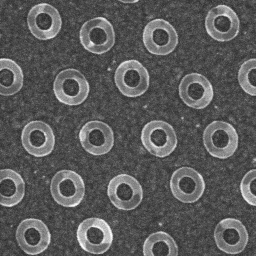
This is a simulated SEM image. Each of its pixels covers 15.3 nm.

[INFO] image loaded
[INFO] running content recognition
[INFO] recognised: a regular array of ring-shaped raised bodies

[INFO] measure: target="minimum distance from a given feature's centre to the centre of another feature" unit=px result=54.7